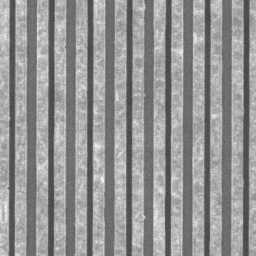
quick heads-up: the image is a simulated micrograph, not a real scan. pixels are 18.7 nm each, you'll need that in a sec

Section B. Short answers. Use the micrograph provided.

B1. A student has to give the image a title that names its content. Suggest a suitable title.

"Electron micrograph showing parallel lines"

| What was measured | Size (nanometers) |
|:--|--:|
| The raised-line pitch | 369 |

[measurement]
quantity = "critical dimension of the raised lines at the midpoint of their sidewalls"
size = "208 nm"